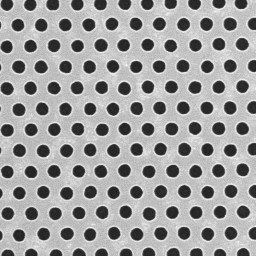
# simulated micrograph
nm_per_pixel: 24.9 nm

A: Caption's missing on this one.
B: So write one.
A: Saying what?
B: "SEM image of a regular array of holes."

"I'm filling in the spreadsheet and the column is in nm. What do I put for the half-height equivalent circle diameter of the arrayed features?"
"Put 327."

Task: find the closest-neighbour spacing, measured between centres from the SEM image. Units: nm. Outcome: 574